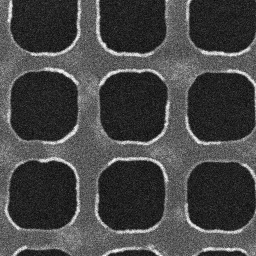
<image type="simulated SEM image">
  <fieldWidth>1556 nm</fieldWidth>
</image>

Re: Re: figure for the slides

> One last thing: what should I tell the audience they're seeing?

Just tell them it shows holes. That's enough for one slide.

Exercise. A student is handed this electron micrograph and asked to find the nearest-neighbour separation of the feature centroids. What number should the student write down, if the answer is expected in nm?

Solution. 541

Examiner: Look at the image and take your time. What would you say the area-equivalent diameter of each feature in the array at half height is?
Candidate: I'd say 0.445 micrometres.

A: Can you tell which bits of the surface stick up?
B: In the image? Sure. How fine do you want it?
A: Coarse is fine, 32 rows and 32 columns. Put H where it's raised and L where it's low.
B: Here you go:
HHLLLLLLLLHHLLLLLLLLLHHHLLLLLLLL
HLLLLLLLLLHHLLLLLLLLLHHHLLLLLLLL
HLLLLLLLLLHHLLLLLLLLLHHHLLLLLLLL
HLLLLLLLLLHHLLLLLLLLLHHHLLLLLLLL
HHLLLLLLLLHHHLLLLLLLLHHHLLLLLLLL
HHLLLLLLLHHHHLLLLLLLHHHHLLLLLLLH
HHHHLLLLHHHHHHHLLLLHHHHHHHHLLLHH
HHHHHHHHHHHHHHHHHHHHHHHHHHHHHHHH
HHHHHHHHHHHHHHHHHHHHHHHHHHHHHHHH
HHHLLLLLHHHHHHLLLLLLHHHHHLLLLLLH
HHLLLLLLLHHHHLLLLLLLLHHHLLLLLLLL
HLLLLLLLLLHHLLLLLLLLLHHLLLLLLLLL
HLLLLLLLLLHHLLLLLLLLLHHLLLLLLLLL
HLLLLLLLLLHHLLLLLLLLLHHLLLLLLLLL
HLLLLLLLLLHHLLLLLLLLLHHLLLLLLLLL
HLLLLLLLLLHHHLLLLLLLLHHHLLLLLLLL
HHLLLLLLLHHHHLLLLLLLHHHHLLLLLLLH
HHHLLLLHHHHHHHLLLLLHHHHHHLLLLLHH
HHHHHHHHHHHHHHHHHHHHHHHHHHHHHHHH
HHHHHHHHHHHHHHHHHHHHHHHHHHHHHHHH
HHHLLLLLHHHHHHLLLLLLHHHHHLLLLLHH
HHLLLLLLLHHHHLLLLLLLHHHHLLLLLLLH
HLLLLLLLLLHHLLLLLLLLLHHLLLLLLLLL
HLLLLLLLLLHHLLLLLLLLLHHLLLLLLLLL
HLLLLLLLLLHHLLLLLLLLLHHLLLLLLLLL
HLLLLLLLLLHHLLLLLLLLLHHLLLLLLLLL
HLLLLLLLLHHHLLLLLLLLHHHLLLLLLLLL
HHLLLLLLLHHHHLLLLLLLHHHHLLLLLLLH
HHHLLLLLHHHHHHLLLLLHHHHHHLLLLLHH
HHHHHHHHHHHHHHHHHHHHHHHHHHHHHHHH
HHHHHHHHHHHHHHHHHHHHHHHHHHHHHHHH
HHHLLLLLHHHHHHHLLLLHHHHHHLLLLLHH